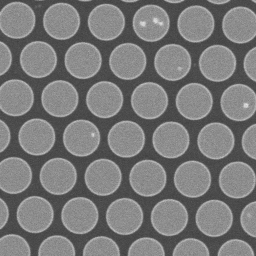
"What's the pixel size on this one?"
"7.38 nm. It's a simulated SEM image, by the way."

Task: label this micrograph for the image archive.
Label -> an array of small figures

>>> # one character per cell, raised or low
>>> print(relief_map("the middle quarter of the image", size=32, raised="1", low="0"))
01111111100011111111000111111111
01111111100011111111000111111110
00111111000001111110000011111110
00011100000000111100000001111000
10000000011000000000000000000000
11000001111110000011111100000011
11100011111111000011111110000111
11100011111111000111111111000111
11100011111111100111111111001111
11100011111111100111111111001111
11100011111111000111111111001111
11100001111111000011111110000111
11000001111110000011111110000111
00000000000000000000111000000001
00111110000000111000000000110000
01111111000011111110000011111100
11111111100011111111000111111100
11111111100111111111001111111110
11111111100111111111001111111110
11111111100111111111001111111110
11111111000111111111000111111110
01111111000011111110000111111100
00111110000001111100000011111100
00000000000000000000000000000000
10000001111100000001111000000011
11000011111110000011111100000111
11100011111111000111111110001111
11100111111111000111111110001111
11100111111111001111111110001111
11100111111111000111111110001111
11000011111111000111111110001111
11000011111110000111111100000111